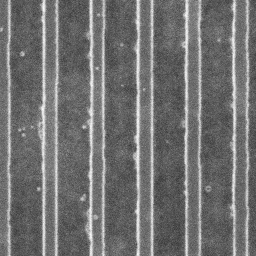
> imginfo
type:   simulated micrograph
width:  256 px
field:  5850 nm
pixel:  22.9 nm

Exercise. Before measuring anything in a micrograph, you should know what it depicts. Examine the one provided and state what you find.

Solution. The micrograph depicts lines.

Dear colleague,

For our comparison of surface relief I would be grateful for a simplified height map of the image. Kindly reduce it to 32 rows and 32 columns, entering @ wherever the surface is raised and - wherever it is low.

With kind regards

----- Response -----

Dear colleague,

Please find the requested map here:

@----@@----@@----@@----@@----@@-
@----@@----@@----@@----@@----@@-
@----@@----@@----@@----@@----@@-
@----@@----@@----@@----@@----@@-
@----@@----@@----@@----@@----@@-
@----@@----@@----@@----@@----@@-
@----@@----@@----@@----@@----@@-
@----@@----@@----@@----@@----@@-
@----@@----@@----@@----@@----@@-
@----@@----@@----@@----@@----@@-
@----@@----@@----@@----@@----@@-
@----@@----@@----@@----@@----@@-
@----@@----@@----@@----@@----@@-
@----@@----@@----@@----@@----@@-
@----@@----@@----@@----@@----@@-
@----@@----@@----@@----@@----@@-
@----@@----@@----@@----@@----@@-
@----@@----@@----@@----@@----@@-
@----@@----@@----@@----@@----@@-
@----@@----@@----@@----@@----@@-
@----@@----@@----@@----@@----@@-
@----@@----@@----@@----@@----@@-
@----@@----@@----@@----@@----@@-
@----@@----@@----@@----@@----@@-
@----@@----@@----@@----@@----@@-
@----@@----@@----@@----@@----@@-
@----@@----@@----@@----@@----@@-
@----@@----@@----@@----@@----@@-
@----@@----@@----@@----@@----@@-
@----@@----@@----@@----@@----@@-
@----@@----@@----@@----@@----@@-
@----@@----@@----@@----@@----@@-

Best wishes